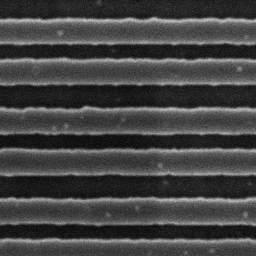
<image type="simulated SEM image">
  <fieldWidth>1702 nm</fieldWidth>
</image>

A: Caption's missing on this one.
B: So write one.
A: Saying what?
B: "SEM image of lines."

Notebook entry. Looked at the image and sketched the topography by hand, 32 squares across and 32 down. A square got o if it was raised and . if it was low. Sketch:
................................
................................
.oooo..ooooo.o.oo.oo...oooooooo.
oooooooooooooooooooooooooooooooo
oooooooooooooooooooooooooooooooo
.ooo....o..o.oo......o..oo...ooo
................................
...o...oo....o..o....o....o.....
oooooooooooooooooooooooooooooooo
oooooooooooooooooooooooooooooooo
oo..oo..o...o.o..o..o.o...oo.o..
................................
................................
..........oo....................
oooooooooooooooooooooooooooooooo
oooooooooooooooooooooooooooooooo
oooooooooooooooooooooooooooooooo
................................
................................
oooooooooooooooooooooooooooooooo
oooooooooooooooooooooooooooooooo
oooooooooooooooooooooooooooooooo
................................
................................
................................
oooooooooooooooooooooooooooooooo
oooooooooooooooooooooooooooooooo
oooooooooooooooooooooooooooooooo
................................
................................
oooooooooooooooooooooooooooooooo
oooooooooooooooooooooooooooooooo